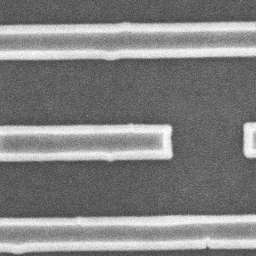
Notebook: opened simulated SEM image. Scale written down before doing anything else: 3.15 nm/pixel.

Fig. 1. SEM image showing one or a few lines or trenches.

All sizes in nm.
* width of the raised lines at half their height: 87.8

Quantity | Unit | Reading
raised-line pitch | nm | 303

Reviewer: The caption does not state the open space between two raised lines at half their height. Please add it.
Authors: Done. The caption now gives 215 nm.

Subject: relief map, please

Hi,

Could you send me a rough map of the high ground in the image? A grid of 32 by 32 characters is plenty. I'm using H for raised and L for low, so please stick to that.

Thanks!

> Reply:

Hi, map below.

LLLLLLLLLLLLLLLLLLLLLLLLLLLLLLLL
LLLLLLLLLLLLLLLLLLLLLLLLLLLLLLLL
LLLLLLLLLLLLLLLLLLLLLLLLLLLLLLLL
LLLLLLLLLHHHHHHHHHHHHHHHHHHHHHHH
HHHHHHHHHHHHHHHHHHHHHHHHHHHHHHHH
HHHHHHHHHHHHHHHHHHHHHHHHHHHHHHHH
HHHHHHHHHHHHHHHHHHHHHHHHHHHHHHHH
LLLLLLLLLLLLLLLLLLLLLLLLLLLLLLLL
LLLLLLLLLLLLLLLLLLLLLLLLLLLLLLLL
LLLLLLLLLLLLLLLLLLLLLLLLLLLLLLLL
LLLLLLLLLLLLLLLLLLLLLLLLLLLLLLLL
LLLLLLLLLLLLLLLLLLLLLLLLLLLLLLLL
LLLLLLLLLLLLLLLLLLLLLLLLLLLLLLLL
LLLLLLLLLLLLLLLLLLLLLLLLLLLLLLLL
LLLLLLLLLLLLLLLLLLLLLLLLLLLLLLLL
LLLLLLLLLLLLLLLLLLLLLLLLLLLLLLLL
HHHHHHHHHHHHHHHHHHHHHLLLLLLLLLLH
HHHHHHHHHHHHHHHHHHHHHLLLLLLLLLLH
HHHHHHHHHHHHHHHHHHHHHLLLLLLLLLLH
HHHHHHHHHHHHHHHHLLLLLLLLLLLLLLLL
LLLLLLLLLLLLLLLLLLLLLLLLLLLLLLLL
LLLLLLLLLLLLLLLLLLLLLLLLLLLLLLLL
LLLLLLLLLLLLLLLLLLLLLLLLLLLLLLLL
LLLLLLLLLLLLLLLLLLLLLLLLLLLLLLLL
LLLLLLLLLLLLLLLLLLLLLLLLLLLLLLLL
LLLLLLLLLLLLLLLLLLLLLLLLLLLLLLLL
LLLLLLLLLLLLLLLLLLLLLLLLLLLLLLLL
LLLLLLLLLHHLLLLLLLHHHHHHHHHHHHHH
HHHHHHHHHHHHHHHHHHHHHHHHHHHHHHHH
HHHHHHHHHHHHHHHHHHHHHHHHHHHHHHHH
HHHHHHHHHHHHHHHHHHHHHHHHHHHHHHHH
LLLLLLLLLLLLLLLLLLLLLLLLLLLLLLLL